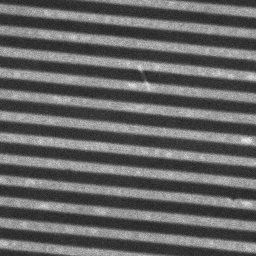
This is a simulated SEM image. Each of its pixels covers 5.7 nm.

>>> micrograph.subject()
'parallel lines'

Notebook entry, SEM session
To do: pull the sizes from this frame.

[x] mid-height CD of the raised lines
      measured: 0.0496 µm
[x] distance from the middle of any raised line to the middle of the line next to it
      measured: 121 nm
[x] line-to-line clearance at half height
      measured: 74.5 nm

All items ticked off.